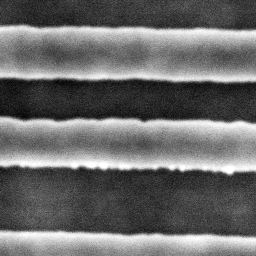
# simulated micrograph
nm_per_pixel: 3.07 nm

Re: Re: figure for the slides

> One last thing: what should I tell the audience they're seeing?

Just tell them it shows lines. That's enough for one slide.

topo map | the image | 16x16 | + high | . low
................
................
++++++++++++++++
++++++++++++++++
++++++++++++++++
................
................
+...............
++++++++++++++++
++++++++++++++++
.......++..+++++
................
................
................
................
++++++++++++++++